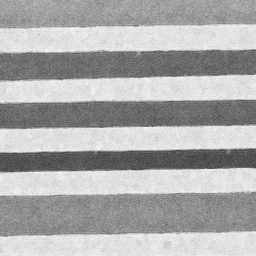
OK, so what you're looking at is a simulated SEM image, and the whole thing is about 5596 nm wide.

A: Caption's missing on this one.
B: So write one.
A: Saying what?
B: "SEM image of lines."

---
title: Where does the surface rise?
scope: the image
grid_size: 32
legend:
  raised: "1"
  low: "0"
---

00000000000000000000000000000000
00000000000000000000000000000000
00000000000000000000000000000000
00000000000011111111111111111111
11111111111111111111111111111111
11111111111111111111111111111111
00000000000000000000000000000000
00000000000000000000000000000000
00000000000000000000000000000000
00000000000000000000000000001111
11111111111111111111111111111111
11111111111111111111111111111111
11111111111111111100000000000000
00000000000000000000000000000000
00000000000000000000000000000000
00000000000000000000000000000000
11111111111111111111111111111111
11111111111111111111111111111111
11111111111111111111111111111000
00000000000000000000000000000000
00000000000000000000000000000000
00001111111111111111111111111111
11111111111111111111111111111111
11111111111111111111111111111111
00000000000000000000000000000000
00000000000000000000000000000000
00000000000000000000000000000000
00000000000000000000000000000000
00000000000000000000000000000000
00000000011111111111111111111111
11111111111111111111111111111111
11111111111111111111111111111111